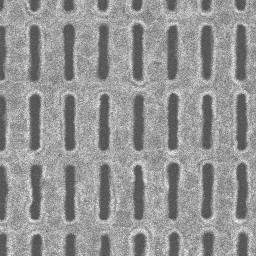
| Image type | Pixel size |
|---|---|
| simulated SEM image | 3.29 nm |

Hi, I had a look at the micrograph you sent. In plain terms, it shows a regular array of holes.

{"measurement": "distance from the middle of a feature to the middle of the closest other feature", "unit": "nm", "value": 113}